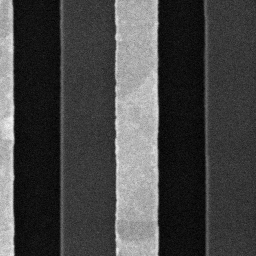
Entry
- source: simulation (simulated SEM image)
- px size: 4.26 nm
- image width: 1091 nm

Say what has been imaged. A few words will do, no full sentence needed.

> lines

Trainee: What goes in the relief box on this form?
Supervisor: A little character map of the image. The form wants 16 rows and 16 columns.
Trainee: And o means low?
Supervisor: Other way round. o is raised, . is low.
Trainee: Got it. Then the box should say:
o...oooooo...ooo
o...oooooo...ooo
o...oooooo...ooo
o...oooooo...ooo
o...oooooo...ooo
o...oooooo...ooo
o...oooooo...ooo
o...oooooo...ooo
o...oooooo...ooo
o...oooooo...ooo
o...oooooo...ooo
o...oooooo...ooo
o...oooooo...ooo
o...oooooo...ooo
o...oooooo...ooo
o...oooooo...ooo